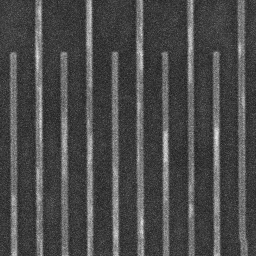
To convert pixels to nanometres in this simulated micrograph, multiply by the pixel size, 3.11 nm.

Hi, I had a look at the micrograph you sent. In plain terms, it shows parallel lines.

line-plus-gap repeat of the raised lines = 25.3 pixels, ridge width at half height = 15.5 nm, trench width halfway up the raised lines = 0.0613 microns